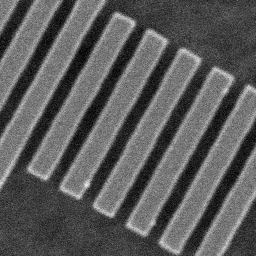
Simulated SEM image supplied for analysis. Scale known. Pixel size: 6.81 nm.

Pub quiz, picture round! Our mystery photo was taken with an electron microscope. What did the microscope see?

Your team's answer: groups of lines, slits or small figures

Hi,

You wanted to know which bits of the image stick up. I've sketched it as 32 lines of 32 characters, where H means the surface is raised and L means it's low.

HHLLHHHLLHHHHLLLLLLLLLLLLLLLLLLL
HLLLHHHLLHHHLLLLLLLLLLLLLLLLLLLL
HLLHHHLLHHHHLLHHLLLLLLLLLLLLLLLL
LLLHHHLLHHHLLHHHHLLLLLLLLLLLLLLL
LLHHHLLHHHLLLHHHLLHHLLLLLLLLLLLL
LHHHHLLHHHLLHHHLLLHHHLLLLLLLLLLL
LHHHLLHHHLLLHHHLLHHHLLHLLLLLLLLL
HHHHLLHHHLLHHHLLLHHHLLHHHLLLLLLL
HHHLLHHHLLLHHHLLHHHLLHHHHLLLLLLL
HHLLLHHHLLHHHLLHHHHLLHHHLLHHHLLL
HHLLHHHLLHHHHLLHHHLLHHHLLLHHHLLL
HLLHHHHLLHHHLLHHHLLLHHHLLHHHLLHH
HLLHHHLLHHHLLLHHHLLHHHLLHHHHLLHH
LLHHHLLLHHHLLHHHLLLHHHLLHHHLLHHH
LLHHHLLHHHLLLHHHLLHHHLLHHHLLLHHH
LHHHLLLHHHLLHHHLLHHHHLLHHHLLHHHL
LHHHLLHHHLLHHHHLLHHHLLHHHLLLHHHL
HHHLLHHHHLLHHHLLHHHLLLHHHLLHHHLL
HHHLLHHHLLHHHHLLHHHLLHHHLLLHHHLL
HHLLHHHHLLHHHLLHHHLLLHHHLLHHHLLH
HHLLHHHLLHHHLLLHHHLLHHHLLHHHHLLH
HLLLHHLLLHHHLLHHHLLHHHHLLHHHLLHH
HLLLLLLLHHHLLLHHHLLHHHLLHHHLLLHH
LLLLLLLLHHHLLHHHLLHHHHLLHHHLLHHH
LLLLLLLLLHLLHHHHLLHHHLLHHHLLLHHH
LLLLLLLLLLLLHHHLLHHHLLLHHHLLHHHL
LLLLLLLLLLLLLHLLLHHHLLHHHLLHHHHL
LLLLLLLLLLLLLLLLHHHLLHHHHLLHHHLL
LLLLLLLLLLLLLLLLLHHLLHHHLLHHHLLL
LLLLLLLLLLLLLLLLLLLLHHHLLLHHHLLL
LLLLLLLLLLLLLLLLLLLLHHHLLHHHLLLL
LLLLLLLLLLLLLLLLLLLLLLLLLHHHLLLL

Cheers